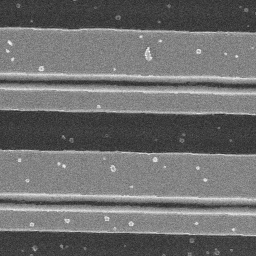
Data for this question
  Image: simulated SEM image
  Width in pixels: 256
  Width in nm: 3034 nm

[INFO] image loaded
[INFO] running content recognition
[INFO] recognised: lines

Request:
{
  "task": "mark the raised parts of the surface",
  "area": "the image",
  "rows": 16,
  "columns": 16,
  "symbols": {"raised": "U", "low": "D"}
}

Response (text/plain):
DDDDDDDDDDDDDDDD
DDDDDDDDDDDDDDDD
UUUUUUUUUUUUUUUU
UUUUUUUUUUUUUUUU
UUUUUUUUUUUUUUUU
UUUUUUUUUUUUUUUU
UUUUUUUUUUUUUUUU
DDDDDDDDDDDDDDDD
DDDDDDDDDDDDDDDD
UUUDUDDDDDDDDDDD
UUUUUUUUUUUUUUUU
UUUUUUUUUUUUUUUU
UUUUUUUUUUUUUUUU
UUUUUUUUUUUUUUUU
DDDDDDUUUUUUUUUU
DDDDDDDDDDDDDDDD